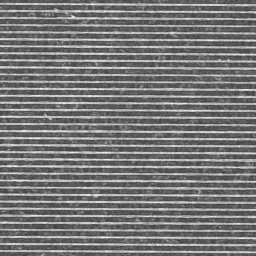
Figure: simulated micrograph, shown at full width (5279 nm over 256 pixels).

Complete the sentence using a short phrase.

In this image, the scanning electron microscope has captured parallel lines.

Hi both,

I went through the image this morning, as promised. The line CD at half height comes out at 0.0284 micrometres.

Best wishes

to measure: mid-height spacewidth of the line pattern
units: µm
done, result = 0.116